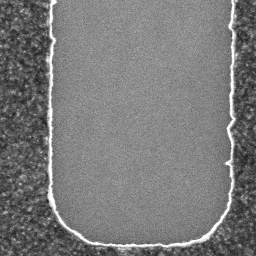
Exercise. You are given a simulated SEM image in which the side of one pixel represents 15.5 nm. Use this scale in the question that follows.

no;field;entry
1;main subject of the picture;one or a few lines or trenches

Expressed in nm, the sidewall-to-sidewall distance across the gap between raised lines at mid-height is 2790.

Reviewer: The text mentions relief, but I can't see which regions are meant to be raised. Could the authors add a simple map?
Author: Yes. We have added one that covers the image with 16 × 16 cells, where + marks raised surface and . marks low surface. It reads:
+++............+
+++...........++
+++............+
+++............+
+++...........++
+++...........++
+++...........++
+++...........++
+++...........++
+++...........++
+++...........++
+++...........++
+++...........++
++++..........++
+++++........+++
++++++++++++++++